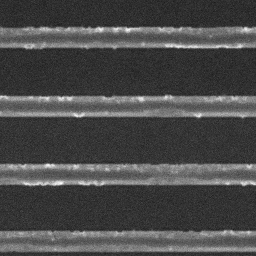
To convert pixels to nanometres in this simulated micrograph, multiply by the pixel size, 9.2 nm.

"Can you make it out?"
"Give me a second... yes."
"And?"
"lines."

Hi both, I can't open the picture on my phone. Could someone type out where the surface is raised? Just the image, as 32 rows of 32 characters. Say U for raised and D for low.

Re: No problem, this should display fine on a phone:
DDDDDDDDDDDDDDDDDDDDDDDDDDDDDDDD
DDDDDDDDDDDDDDDDDDDDDDDDDDDDDDDD
DDDDDDDDDDDDDDDDDDDDDDDDDDDDDDDD
DDDDDDDDDDDDDDDDDDDDDDDDDDDDDDDD
UUUUUUUUUUUUUUUUUUUUUUUUUUUUUUUU
UUUUUUUUUUUUUUUUUUUUUUUUUUUUUUUU
DDDDDDDDDDDDDDDDDDDDDDDDDDDDDDDD
DDDDDDDDDDDDDDDDDDDDDDDDDDDDDDDD
DDDDDDDDDDDDDDDDDDDDDDDDDDDDDDDD
DDDDDDDDDDDDDDDDDDDDDDDDDDDDDDDD
DDDDDDDDDDDDDDDDDDDDDDDDDDDDDDDD
DDDDDDDDDDDDDDDDDDDDDDDDDDDDDDDD
UUUUUUUUUUUUUUUUUUUUUUUUUUUUUUUU
UUUUUUUUUUUUUUUUUUUUUUUUUUUUUUUU
DDDDDDDDDDDDDDDDDDDDDDDDDDDDDDDD
DDDDDDDDDDDDDDDDDDDDDDDDDDDDDDDD
DDDDDDDDDDDDDDDDDDDDDDDDDDDDDDDD
DDDDDDDDDDDDDDDDDDDDDDDDDDDDDDDD
DDDDDDDDDDDDDDDDDDDDDDDDDDDDDDDD
DDDDDDDDDDDDDDDDDDDDDDDDDDDDDDDD
DDDDDDDDDDDDDDDDDDDDDDDDDDDDDDDD
UUUUUUUUUUUUUUUUUUUUUUUUUUUUUUUU
UUUUUUUUUUUUUUUUUUUUUUUUUUUUUUUU
DDDDDDDDDDDDDDDDDDDDDDDDDDDDDDDD
DDDDDDDDDDDDDDDDDDDDDDDDDDDDDDDD
DDDDDDDDDDDDDDDDDDDDDDDDDDDDDDDD
DDDDDDDDDDDDDDDDDDDDDDDDDDDDDDDD
DDDDDDDDDDDDDDDDDDDDDDDDDDDDDDDD
DDDDDDDDDDDDDDDDDDDDDDDDDDDDDDDD
UUUUUUUUUUUUUUUUUUUUUUUUUUUUUUUU
UUUUUUUUUUUUUUUUUUUUUUUUUUUUUUUU
DDDDDDDDDDDDDDDDDDDDDDDDDDDDDDDD